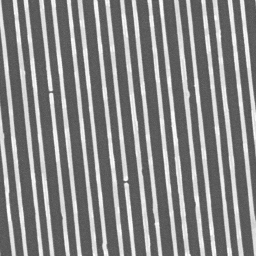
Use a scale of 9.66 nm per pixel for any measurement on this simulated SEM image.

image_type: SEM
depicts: parallel lines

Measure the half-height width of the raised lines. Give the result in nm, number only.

34.8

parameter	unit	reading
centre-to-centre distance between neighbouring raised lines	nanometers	130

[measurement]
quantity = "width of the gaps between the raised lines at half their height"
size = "0.0877 micrometres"